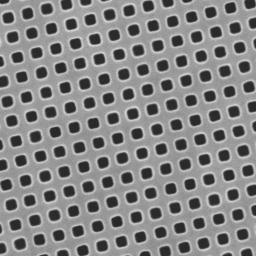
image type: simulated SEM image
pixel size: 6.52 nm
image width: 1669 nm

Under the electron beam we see a regular array of holes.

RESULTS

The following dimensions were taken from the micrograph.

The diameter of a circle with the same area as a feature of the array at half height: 0.0739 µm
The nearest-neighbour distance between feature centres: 128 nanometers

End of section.